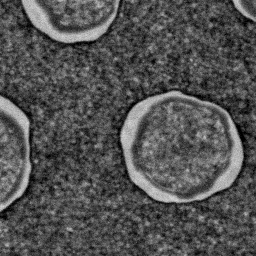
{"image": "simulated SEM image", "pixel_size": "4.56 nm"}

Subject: raised bodies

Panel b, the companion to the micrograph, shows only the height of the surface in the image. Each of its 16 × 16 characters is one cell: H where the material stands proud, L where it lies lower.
LLHHHHHLLLLLLLLH
LLLHHHHLLLLLLLLL
LLLLLLLLLLLLLLLL
LLLLLLLLLLLLLLLL
LLLLLLLLLLLLLLLL
LLLLLLLLLLLLLLLL
LLLLLLLLLHHHHLLL
HLLLLLLLHHHHHHLL
HHLLLLLLHHHHHHHL
HHLLLLLLHHHHHHHL
HHLLLLLLHHHHHHLL
HHLLLLLLLHHHHHLL
HLLLLLLLLLLHLLLL
LLLLLLLLLLLLLLLL
LLLLLLLLLLLLLLLL
LLLLLLLLLLLLLLLL